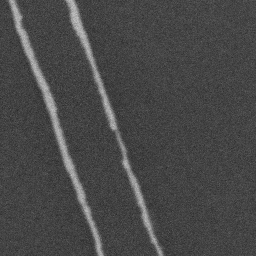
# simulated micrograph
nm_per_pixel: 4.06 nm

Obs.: one or a few lines or trenches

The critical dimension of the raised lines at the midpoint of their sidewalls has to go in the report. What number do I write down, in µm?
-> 0.23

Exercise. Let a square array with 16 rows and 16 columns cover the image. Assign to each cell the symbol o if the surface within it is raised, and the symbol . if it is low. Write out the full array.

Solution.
.oooo...........
.oooo...........
.oooo...........
..oooo..........
..oooo..........
...ooo..........
...oooo.........
...oooo.........
....ooo.........
....oooo........
....oooo........
.....oooo.......
.....oooo.......
......ooo.......
......ooo.......
......oooo......